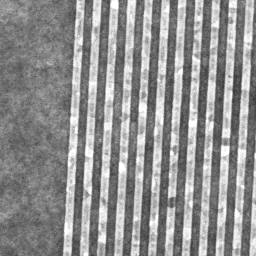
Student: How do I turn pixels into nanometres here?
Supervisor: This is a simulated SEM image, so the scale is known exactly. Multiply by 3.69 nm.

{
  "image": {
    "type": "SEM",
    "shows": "parallel lines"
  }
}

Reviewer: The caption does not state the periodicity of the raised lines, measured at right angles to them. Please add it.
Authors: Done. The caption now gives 62.4 nanometres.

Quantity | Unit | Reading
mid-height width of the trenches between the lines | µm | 0.04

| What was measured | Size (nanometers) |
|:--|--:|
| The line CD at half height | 23.5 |